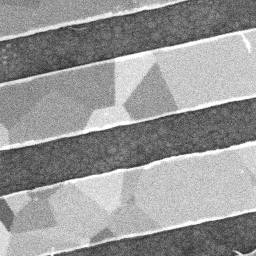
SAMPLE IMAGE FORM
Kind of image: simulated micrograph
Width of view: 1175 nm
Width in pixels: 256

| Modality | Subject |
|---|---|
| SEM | one or a few lines or trenches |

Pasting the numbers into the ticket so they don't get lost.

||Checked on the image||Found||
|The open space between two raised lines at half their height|200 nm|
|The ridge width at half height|65.5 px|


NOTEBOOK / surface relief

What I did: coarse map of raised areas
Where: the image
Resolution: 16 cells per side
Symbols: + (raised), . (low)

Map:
+++++++++.......
++++............
.............+++
........++++++++
....++++++++++++
++++++++++++++++
+++++++++++++...
+++++++++.......
++++............
.............+++
.........+++++++
....++++++++++++
++++++++++++++++
++++++++++++++..
++++++++++......
+++++...........